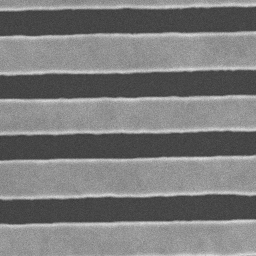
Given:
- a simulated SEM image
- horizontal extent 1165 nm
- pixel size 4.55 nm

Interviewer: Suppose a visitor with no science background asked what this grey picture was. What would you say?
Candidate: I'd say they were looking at lines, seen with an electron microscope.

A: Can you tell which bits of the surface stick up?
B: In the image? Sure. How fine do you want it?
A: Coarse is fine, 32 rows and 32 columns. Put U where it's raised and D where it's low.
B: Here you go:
UUUUUUUUUUUUUUUUUUUUUUUUUUUUUUUU
DDDDDDDDDDDDDDDDDDDDDDDDDDDDDDDD
DDDDDDDDDDDDDDDDDDDDDDDDDDDDDDDD
DDDDDDDDDDDDDDDDDDDDDDDDDDDDDDDD
DUUDDUUUUUUUUUUUUUUUUUUUUUUUUUUU
UUUUUUUUUUUUUUUUUUUUUUUUUUUUUUUU
UUUUUUUUUUUUUUUUUUUUUUUUUUUUUUUU
UUUUUUUUUUUUUUUUUUUUUUUUUUUUUUUU
UUUUUUUUUUUUUUUUUUUUUUUUUUUUUUUU
DDDDDDDDDDDDDDDDDDDDDDDDDDDDDDDD
DDDDDDDDDDDDDDDDDDDDDDDDDDDDDDDD
DDDDDDDDDDDDDDDDDDDDDDDDDDDDDDDD
UUUUUUUUUUUUUUUUUUUUUUUUUUUUUUUU
UUUUUUUUUUUUUUUUUUUUUUUUUUUUUUUU
UUUUUUUUUUUUUUUUUUUUUUUUUUUUUUUU
UUUUUUUUUUUUUUUUUUUUUUUUUUUUUUUU
UUUUUUUUUUUUUUUUUUUUUUUUDDDDDDDD
DDDDDDDDDDDDDDDDDDDDDDDDDDDDDDDD
DDDDDDDDDDDDDDDDDDDDDDDDDDDDDDDD
DDDDDDDDDDDDDDDDDDDDDDDDDDDDDDDU
UUUUUUUUUUUUUUUUUUUUUUUUUUUUUUUU
UUUUUUUUUUUUUUUUUUUUUUUUUUUUUUUU
UUUUUUUUUUUUUUUUUUUUUUUUUUUUUUUU
UUUUUUUUUUUUUUUUUUUUUUUUUUUUUUUU
UUUUUUUUUUUUUUUUUUUUUUDDDDDDDDDD
DDDDDDDDDDDDDDDDDDDDDDDDDDDDDDDD
DDDDDDDDDDDDDDDDDDDDDDDDDDDDDDDD
DDDDDDDDDDDDDDDDDDDDDDDDDDDDDUUU
UUUUUUUUUUUUUUUUUUUUUUUUUUUUUUUU
UUUUUUUUUUUUUUUUUUUUUUUUUUUUUUUU
UUUUUUUUUUUUUUUUUUUUUUUUUUUUUUUU
UUUUUUUUUUUUUUUUUUUUUUUUUUUUUUUU